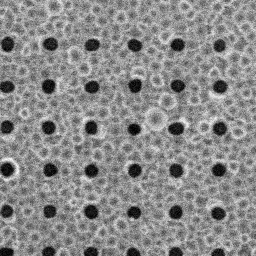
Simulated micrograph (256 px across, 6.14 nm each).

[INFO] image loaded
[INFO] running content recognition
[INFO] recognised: a regular array of holes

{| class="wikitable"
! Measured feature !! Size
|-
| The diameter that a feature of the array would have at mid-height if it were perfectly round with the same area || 88.9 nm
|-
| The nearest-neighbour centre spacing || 253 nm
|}